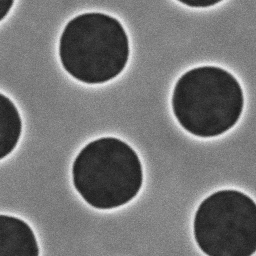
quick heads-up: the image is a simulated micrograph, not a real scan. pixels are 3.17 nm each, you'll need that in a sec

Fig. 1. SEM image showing holes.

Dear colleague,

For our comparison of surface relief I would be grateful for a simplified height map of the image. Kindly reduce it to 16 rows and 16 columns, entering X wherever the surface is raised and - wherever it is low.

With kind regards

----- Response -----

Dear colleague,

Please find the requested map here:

-XXXXXXXXXXXXXXX
XXXX----XXXXXXXX
XXXX----XXXXXXXX
XXXX----XXXXXXXX
XXXX----XXXX--XX
XXXXXXXXXXX----X
-XXXXXXXXXX----X
-XXXXXXXXXX----X
-XXXXXXXXXXX-XXX
-XXXX---XXXXXXXX
XXXXX----XXXXXXX
XXXXX----XXXXXXX
XXXXX---XXXXX---
-XXXXXXXXXXX----
--XXXXXXXXXX----
--XXXXXXXXXXX---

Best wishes